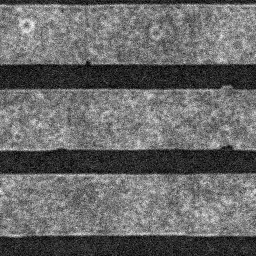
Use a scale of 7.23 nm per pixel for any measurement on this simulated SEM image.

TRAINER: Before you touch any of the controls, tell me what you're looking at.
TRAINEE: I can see one or a few lines or trenches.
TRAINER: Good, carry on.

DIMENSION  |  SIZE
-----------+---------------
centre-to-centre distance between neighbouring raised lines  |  0.616 µm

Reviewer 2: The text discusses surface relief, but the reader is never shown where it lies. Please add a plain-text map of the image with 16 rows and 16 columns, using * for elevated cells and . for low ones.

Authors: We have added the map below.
****************
****************
****************
****************
................
................
****************
****************
****************
................
................
****************
****************
****************
****************
................